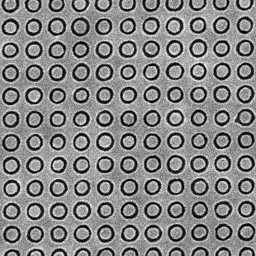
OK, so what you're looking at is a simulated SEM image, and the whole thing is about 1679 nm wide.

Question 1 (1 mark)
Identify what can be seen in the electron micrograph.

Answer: a regular array of ring-shaped grooves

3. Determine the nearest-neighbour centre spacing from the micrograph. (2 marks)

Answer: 149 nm